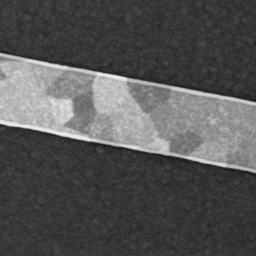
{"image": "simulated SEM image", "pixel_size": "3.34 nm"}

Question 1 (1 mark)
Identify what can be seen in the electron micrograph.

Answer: one or a few lines or trenches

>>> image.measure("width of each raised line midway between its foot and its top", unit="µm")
0.22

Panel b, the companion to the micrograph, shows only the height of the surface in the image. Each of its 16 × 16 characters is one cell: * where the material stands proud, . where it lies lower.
................
................
................
................
******..........
***********.....
****************
****************
....************
..........******
...............*
................
................
................
................
................